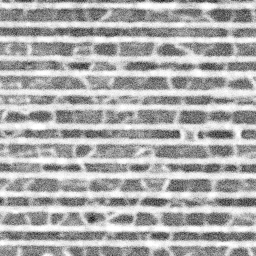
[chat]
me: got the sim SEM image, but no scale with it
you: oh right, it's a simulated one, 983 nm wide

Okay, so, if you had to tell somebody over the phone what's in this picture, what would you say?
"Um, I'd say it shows parallel lines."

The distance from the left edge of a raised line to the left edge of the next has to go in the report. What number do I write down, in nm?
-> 65.2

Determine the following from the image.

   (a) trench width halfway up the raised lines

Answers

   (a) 53.3 nm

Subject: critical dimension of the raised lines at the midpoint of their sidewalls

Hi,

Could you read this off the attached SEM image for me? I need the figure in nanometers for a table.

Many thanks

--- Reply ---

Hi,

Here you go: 16.3